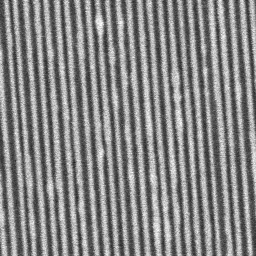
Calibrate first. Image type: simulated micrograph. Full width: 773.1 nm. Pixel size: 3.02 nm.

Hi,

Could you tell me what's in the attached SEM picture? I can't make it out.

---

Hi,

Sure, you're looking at parallel lines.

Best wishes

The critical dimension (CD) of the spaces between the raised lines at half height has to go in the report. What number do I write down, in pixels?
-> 4.6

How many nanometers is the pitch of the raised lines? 30.9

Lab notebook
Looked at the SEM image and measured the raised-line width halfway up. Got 16.6 nm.